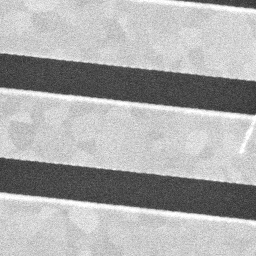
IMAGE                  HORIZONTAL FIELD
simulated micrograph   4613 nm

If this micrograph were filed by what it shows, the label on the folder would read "lines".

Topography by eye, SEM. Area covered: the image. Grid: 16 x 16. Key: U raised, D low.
UUUUUUUUUUUUUUUD
UUUUUUUUUUUUUUUU
UUUUUUUUUUUUUUUU
DDUUUUUUUUUUUUUU
DDDDDDDDDDDUUUUU
DDDDDDDDDDDDDDDD
UUUUUUUUUDDDDDDD
UUUUUUUUUUUUUUUU
UUUUUUUUUUUUUUUU
UUUUUUUUUUUUUUUU
DDDDDDUUUUUUUUUU
DDDDDDDDDDDDDDDU
UUUUDDDDDDDDDDDD
UUUUUUUUUUUUUDDD
UUUUUUUUUUUUUUUU
UUUUUUUUUUUUUUUU